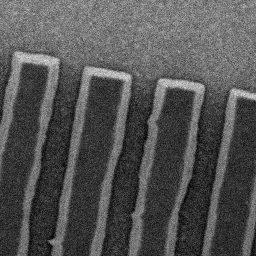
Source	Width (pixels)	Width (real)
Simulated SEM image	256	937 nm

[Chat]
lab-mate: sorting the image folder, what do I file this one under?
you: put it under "one or a few lines or trenches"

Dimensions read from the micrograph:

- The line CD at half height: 143 nm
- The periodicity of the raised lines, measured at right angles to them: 269 nm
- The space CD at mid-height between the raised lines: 127 nm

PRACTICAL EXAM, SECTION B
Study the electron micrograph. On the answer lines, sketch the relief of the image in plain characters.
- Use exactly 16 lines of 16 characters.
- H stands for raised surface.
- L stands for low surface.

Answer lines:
LLLLLLLLLLLLLLLL
LLLLLLLLLLLLLLLL
LLLLLLLLLLLLLLLL
LLLLLLLLLLLLLLLL
LHHLLLLLLLLLLLLL
LHHLLHHHLLHHLLLL
LHHLLHHHLLHHLLLH
HHHLLHHHLLHHLLHH
HHHLLHHLLHHHLLHH
HHLLLHHLLHHHLLHH
HHLLHHHLLHHHLLHH
HHLLHHHLLHHHLLHH
HHLLHHHLLHHLLHHH
HHLLHHLLLHHLLHHH
HHLLHHLLLHHLLHHH
HLLLHHLLHHHLLHHL